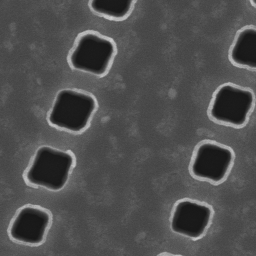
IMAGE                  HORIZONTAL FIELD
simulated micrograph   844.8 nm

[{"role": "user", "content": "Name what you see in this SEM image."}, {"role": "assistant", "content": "holes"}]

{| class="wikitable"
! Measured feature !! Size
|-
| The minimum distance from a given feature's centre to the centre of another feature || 199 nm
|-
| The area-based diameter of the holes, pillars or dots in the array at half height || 116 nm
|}